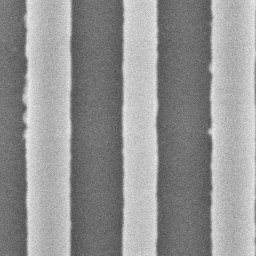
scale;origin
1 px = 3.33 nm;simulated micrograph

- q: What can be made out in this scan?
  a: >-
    lines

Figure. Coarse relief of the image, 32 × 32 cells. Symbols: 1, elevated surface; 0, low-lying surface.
00011111100000001111000000111111
00011111100000001111000000011111
00011111100000001111000000011111
00011111100000001111000000011111
00011111100000001111000000111111
00011111100000001111000000111111
00011111100000001111000000011111
00011111100000001111000000011111
00011111100000011110000000011111
00011111100000001111000000011111
00001111100000001111000000111111
00011111100000001111000000111111
00011111100000001111000000111111
00011111100000011111000000111111
00011111100000011111000000111111
00011111100000011110000000011111
00011111100000011111000000011111
00011111100000011111000000011111
00011111100000011111000000011111
00011111100000011111000000011111
00011111100000001111000000111111
00011111100000001111000000111111
00011111100000001111000000011111
00011111100000001111000000011111
00011111100000001111000000011111
00011111100000001111000000111111
00011111100000001111000000111111
00011111100000001111000000111111
00011111100000011111000000111111
00011111100000011111000000111111
00011111100000011110000000011111
00011111100000011110000000011111